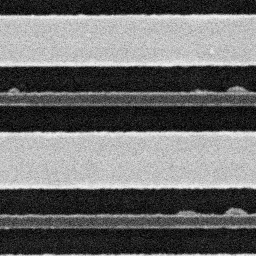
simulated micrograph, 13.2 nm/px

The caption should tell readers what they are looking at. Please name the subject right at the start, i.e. lines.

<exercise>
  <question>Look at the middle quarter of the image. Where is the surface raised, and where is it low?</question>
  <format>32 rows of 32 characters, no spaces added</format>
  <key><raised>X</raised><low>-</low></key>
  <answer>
--------------------------------
--------------------------------
--------------------------------
--------------------------------
--------------------------------
--------------------------------
--------------------------------
XXXXXXXXXXXXXXXXXXXXXXXXXXXXXXXX
XXXXXXXXXXXXXXXXXXXXXXXXXXXXXXXX
XXXXXXXXXXXXXXXXXXXXXXXXXXXXXXXX
--------------------------------
--------------------------------
--------------------------------
--------------------------------
--------------------------------
--------------------------------
--------------------------------
X-XXXXXXXXXXXXXXXXXXXXXXXXXXXXXX
XXXXXXXXXXXXXXXXXXXXXXXXXXXXXXXX
XXXXXXXXXXXXXXXXXXXXXXXXXXXXXXXX
XXXXXXXXXXXXXXXXXXXXXXXXXXXXXXXX
XXXXXXXXXXXXXXXXXXXXXXXXXXXXXXXX
XXXXXXXXXXXXXXXXXXXXXXXXXXXXXXXX
XXXXXXXXXXXXXXXXXXXXXXXXXXXXXXXX
XXXXXXXXXXXXXXXXXXXXXXXXXXXXXXXX
XXXXXXXXXXXXXXXXXXXXXXXXXXXXXXXX
XXXXXXXXXXXXXXXXXXXXXXXXXXXXXXXX
XXXXXXXXXXXXXXXXXXXXXXXXXXXXXXXX
XXXXXXXXXXXXXXXXXXXXXXXXXXXXXXXX
XXXXXXXXXXXXXXXXXXXXXXXXXXXXXXXX
XXXXXXXXXXXXXXXXXXXXXXXXXXXXXXXX
--------------------------------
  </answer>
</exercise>